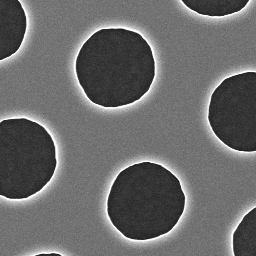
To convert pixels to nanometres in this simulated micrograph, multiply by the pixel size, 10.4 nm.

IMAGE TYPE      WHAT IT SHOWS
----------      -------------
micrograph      holes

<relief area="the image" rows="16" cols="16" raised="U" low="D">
DUUUUUUUUUUUDDDU
DDUUUUUUUUUUUUUU
DUUUUDDDDUUUUUUU
DUUUUDDDDDUUUUUU
UUUUUDDDDDUUUUUU
UUUUUDDDDUUUUUDD
UUUUUUDDUUUUUDDD
DDUUUUUUUUUUUDDD
DDDUUUUUUUUUUUDD
DDDUUUUUUUUUUUUU
DDDUUUUUDDUUUUUU
DDDUUUUDDDDUUUUU
UUUUUUUDDDDDUUUU
UUUUUUUDDDDUUUUD
UUUUUUUUDDUUUUUD
UUUUUUUUUUUUUUUD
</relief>